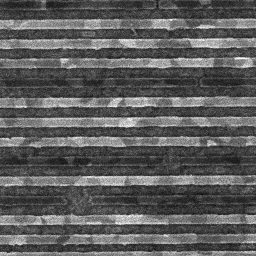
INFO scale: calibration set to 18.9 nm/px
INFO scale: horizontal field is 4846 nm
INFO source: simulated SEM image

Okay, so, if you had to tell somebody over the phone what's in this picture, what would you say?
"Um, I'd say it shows parallel lines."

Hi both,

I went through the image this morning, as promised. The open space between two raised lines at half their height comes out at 206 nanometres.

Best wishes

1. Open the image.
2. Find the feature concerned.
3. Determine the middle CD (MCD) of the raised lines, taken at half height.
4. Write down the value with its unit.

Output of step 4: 168 nanometres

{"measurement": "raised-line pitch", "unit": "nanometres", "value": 370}